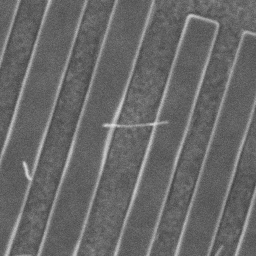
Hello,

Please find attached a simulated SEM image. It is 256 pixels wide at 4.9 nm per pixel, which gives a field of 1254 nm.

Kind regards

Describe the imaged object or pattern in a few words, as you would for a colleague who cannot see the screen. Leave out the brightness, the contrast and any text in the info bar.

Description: groups of lines, slits or small figures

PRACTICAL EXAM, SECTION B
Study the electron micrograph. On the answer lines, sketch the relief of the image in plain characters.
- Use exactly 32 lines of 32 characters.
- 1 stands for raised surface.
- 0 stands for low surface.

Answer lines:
11000011111000111110000000000000
11000011111000111110000000000000
11000111110000111110000111000000
10000111110001111100000111100000
10000111110001111100000111100011
10001111100001111100001111100011
10001111100011111000001111000011
00001111100011111000001111000111
00001111000011111000011111000111
00011111000111110000011110000111
00011111000111110000011110001111
00011110000111110000011110001111
00111110000111100000111110001111
00111110001111100000111100011111
00111100001111100000111100011111
01111100001111000001111100011110
01111100011111000001111000011110
01111000011111000001111000111110
11111000011110000011111000111100
11111000011110000011110000111100
11111000111110000011110001111100
11110000111110000011110001111000
11110000111100000111110001111000
11110001111100000111100011111000
11100001111100000111100011110000
11100001111000001111100011110001
11100011111000001111000111110001
11000011111000001111000111100001
11000011111000011111000111100001
11000111110000011110000111100011
10000111110000011110001111100011
10000111110000111110001111000011